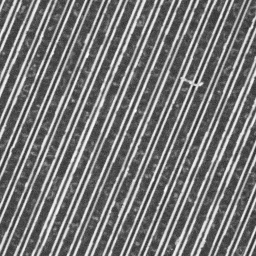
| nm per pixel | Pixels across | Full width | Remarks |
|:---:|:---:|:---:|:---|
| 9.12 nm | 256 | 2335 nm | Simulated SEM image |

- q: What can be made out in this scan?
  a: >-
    parallel lines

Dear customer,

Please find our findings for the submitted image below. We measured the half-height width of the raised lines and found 108 nanometers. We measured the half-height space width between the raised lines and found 41.1 nm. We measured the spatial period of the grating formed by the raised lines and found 0.149 µm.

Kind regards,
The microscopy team